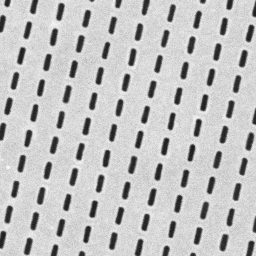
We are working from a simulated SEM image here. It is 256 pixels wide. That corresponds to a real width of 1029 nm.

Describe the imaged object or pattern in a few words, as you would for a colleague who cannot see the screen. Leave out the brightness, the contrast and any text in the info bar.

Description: a regular array of holes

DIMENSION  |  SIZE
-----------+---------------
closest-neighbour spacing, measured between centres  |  0.105 microns